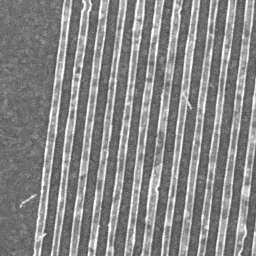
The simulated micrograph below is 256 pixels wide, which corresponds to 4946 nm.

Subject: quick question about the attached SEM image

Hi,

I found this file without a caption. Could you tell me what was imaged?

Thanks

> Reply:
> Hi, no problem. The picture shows parallel lines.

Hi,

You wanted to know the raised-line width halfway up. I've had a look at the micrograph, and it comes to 125 nm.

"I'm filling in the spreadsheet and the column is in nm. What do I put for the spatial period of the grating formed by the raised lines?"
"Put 350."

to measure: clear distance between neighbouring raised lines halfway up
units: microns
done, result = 0.232